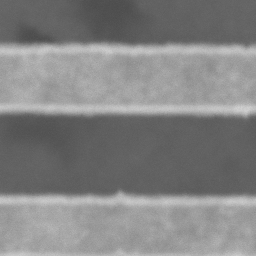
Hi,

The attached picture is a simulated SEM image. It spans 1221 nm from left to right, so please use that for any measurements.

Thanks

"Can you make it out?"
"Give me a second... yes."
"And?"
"one or a few lines or trenches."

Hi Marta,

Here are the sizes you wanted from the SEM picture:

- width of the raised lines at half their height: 279 nm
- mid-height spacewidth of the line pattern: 442 nm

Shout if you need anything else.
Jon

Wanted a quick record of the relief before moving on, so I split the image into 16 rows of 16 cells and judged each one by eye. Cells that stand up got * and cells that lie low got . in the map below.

................
................
................
****************
****************
****************
****************
................
................
................
................
................
.......*........
****************
****************
****************